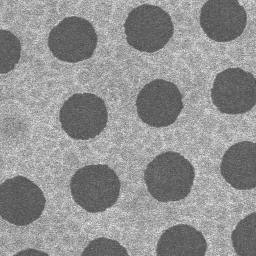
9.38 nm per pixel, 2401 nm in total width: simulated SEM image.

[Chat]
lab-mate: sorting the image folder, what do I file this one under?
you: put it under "holes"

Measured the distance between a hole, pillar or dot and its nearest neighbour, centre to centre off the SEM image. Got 698 nanometers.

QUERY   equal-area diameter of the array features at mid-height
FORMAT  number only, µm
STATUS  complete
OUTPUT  0.456